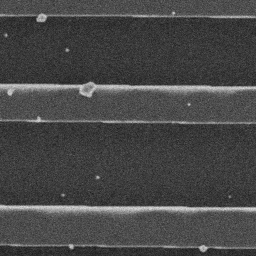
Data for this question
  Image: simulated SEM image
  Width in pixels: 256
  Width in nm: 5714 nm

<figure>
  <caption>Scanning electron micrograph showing lines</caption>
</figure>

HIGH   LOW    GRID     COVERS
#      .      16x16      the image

################
................
................
................
................
################
################
################
................
................
................
................
................
################
################
............####